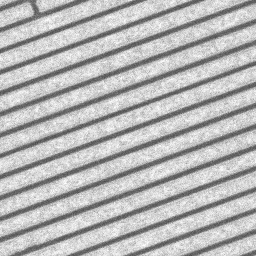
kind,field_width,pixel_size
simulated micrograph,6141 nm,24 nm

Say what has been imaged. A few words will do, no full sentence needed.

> parallel lines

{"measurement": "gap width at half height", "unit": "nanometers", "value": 135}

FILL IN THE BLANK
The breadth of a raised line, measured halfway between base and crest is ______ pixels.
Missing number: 14.2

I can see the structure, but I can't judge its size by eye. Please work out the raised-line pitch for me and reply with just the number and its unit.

473 nm